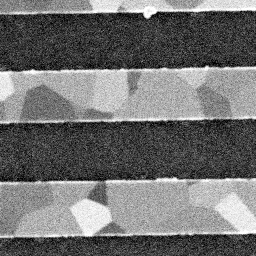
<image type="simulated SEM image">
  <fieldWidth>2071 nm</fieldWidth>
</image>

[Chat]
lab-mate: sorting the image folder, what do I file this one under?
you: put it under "lines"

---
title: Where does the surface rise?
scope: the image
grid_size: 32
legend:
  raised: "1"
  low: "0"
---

11111111111111111111111111111111
11111111111100000011000000000000
00000000000000000000000000000000
00000000000000000000000000000000
00000000000000000000000000000000
00000000000000000000000000000000
00000000000000000000000000000000
00000000000000000000000000000000
00000000000000000000000001001111
11111111111111111111111111111111
11111111111111111111111111111111
11111111111111111111111111111111
11111111111111111111111111111111
11111111111111111111111111111111
11111111111111111111111111111111
00000000000000000000000000000000
00000000000000000000000000000000
00000000000000000000000000000000
00000000000000000000000000000000
00000000000000000000000000000000
00000000000000000000000000000000
00000000000000000000000000000000
00000000000000000000000000000111
11111111111111111111111111111111
11111111111111111111111111111111
11111111111111111111111111111111
11111111111111111111111111111111
11111111111111111111111111111111
11111111111111111111111111111111
11111111000000000000000000000000
00000000000000000000000000000000
00000000000000000000000000000000